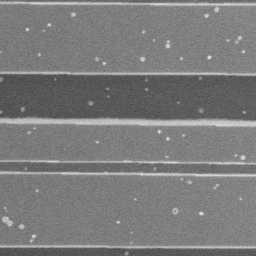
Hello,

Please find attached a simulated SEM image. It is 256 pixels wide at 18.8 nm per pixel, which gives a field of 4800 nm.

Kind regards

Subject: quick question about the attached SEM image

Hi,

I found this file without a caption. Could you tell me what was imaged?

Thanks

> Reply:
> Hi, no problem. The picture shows lines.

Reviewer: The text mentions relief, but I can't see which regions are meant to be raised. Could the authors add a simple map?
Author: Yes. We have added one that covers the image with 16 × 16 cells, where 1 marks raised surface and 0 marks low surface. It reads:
1111111111111111
1111111111111111
1111111111111111
1111111111111111
1111111111111111
0000000000000000
0000000000000000
0000000000000000
1111111111111111
1111111111111111
1111111111111111
1111111111111111
1111111111111111
1111111111111111
1111111111111111
0000000000000000